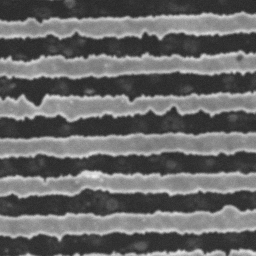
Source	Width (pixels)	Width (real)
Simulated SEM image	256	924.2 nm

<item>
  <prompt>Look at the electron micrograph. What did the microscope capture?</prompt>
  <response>parallel lines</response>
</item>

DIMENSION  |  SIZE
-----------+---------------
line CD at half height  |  68.2 nanometres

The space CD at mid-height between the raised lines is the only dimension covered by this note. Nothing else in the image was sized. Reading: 75 nanometers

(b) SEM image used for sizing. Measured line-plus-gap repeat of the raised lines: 0.143 um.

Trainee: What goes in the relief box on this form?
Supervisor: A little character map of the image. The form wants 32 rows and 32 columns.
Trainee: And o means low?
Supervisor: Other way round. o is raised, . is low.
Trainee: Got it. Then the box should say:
................................
................................
...o..oooooooooooooooooooooooooo
oooooooooooooooooooooooooooooooo
ooooo..oo.oooooo.o.oo...........
................................
................................
oo..oooooooooooooooooooooooooooo
oooooooooooooooooooooooooooooooo
.ooooooooooooo..................
................................
................................
ooo..ooooooooooo.ooooooooooooooo
ooooooooooooooooooooo.oooooooooo
oooo..o.oooo..oo................
................................
................................
ooo.oooooooooooooooooooooooooooo
oooooooooooooooooooooooooooooooo
o.oo...oooo.....................
................................
...........oo...................
oooooooooooooooooooooooooooooooo
oooooooooooooooooooooooooooooooo
o.o.............................
................................
.........................o.ooooo
oooooooooooooooooooooooooooooooo
oooooooooooooooooooooooooooooooo
.ooo..oo........................
.................o..............
......................ooo..o.ooo